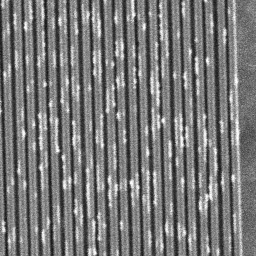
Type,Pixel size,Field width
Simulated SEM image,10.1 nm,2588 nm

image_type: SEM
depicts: parallel lines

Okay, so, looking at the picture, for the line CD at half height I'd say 6.87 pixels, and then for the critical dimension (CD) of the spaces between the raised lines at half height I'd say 4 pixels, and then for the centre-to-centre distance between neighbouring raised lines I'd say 114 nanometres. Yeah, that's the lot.